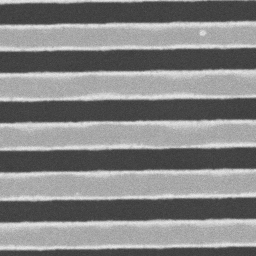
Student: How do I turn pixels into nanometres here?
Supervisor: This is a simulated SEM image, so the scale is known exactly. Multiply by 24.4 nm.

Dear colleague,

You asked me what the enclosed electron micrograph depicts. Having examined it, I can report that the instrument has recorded lines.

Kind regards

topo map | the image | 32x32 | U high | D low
DDDDDDDDDDDDDDDDDDDDDDDDDDDDDDDD
DDDDDDDDDDDDDDDDDDDDDDDDDDDDDDDD
DDDDDDDDDDDDDDDDDDDDDDDDDDDDDDDD
UUUUUUUUUUUUUUUUUUUUUUUUUUUUUUUU
UUUUUUUUUUUUUUUUUUUUUUUUUUUUUUUU
UUUUUUUUUUUUUUUUUUUUUUUUUUUUUUUU
DDDDDDDDDDDDDDDDDDDDDDDDDDDDDDDD
DDDDDDDDDDDDDDDDDDDDDDDDDDDDDDDD
DDDDDDDDDDDDDDDDDDDDDDDDDDDDDDDD
UUUUUUUUUUUUUUUUUUUUUUUUUUUUUUUU
UUUUUUUUUUUUUUUUUUUUUUUUUUUUUUUU
UUUUUUUUUUUUUUUUUUUUUUUUUUUUUUUU
DDDDDDDDDDDDDDDDDDDDDDDDDDDDDDDD
DDDDDDDDDDDDDDDDDDDDDDDDDDDDDDDD
DDDDDDDDDDDDDDDDDDDDDDDDDDDDDDDD
UUUUUUUUUUUUUUUUUUUUUUUUUUUUUUUU
UUUUUUUUUUUUUUUUUUUUUUUUUUUUUUUU
UUUUUUUUUUUUUUUUUUUUUUUUUUUUUUUU
UUUUUUUUUUUUUUUDDDDDDDDDDDDDDDDD
DDDDDDDDDDDDDDDDDDDDDDDDDDDDDDDD
DDDDDDDDDDDDDDDDDDDDDDDDDDDDDDDD
DDDDDDDDDDDDDDUUUUUUUUUUUUUUUUUU
UUUUUUUUUUUUUUUUUUUUUUUUUUUUUUUU
UUUUUUUUUUUUUUUUUUUUUUUUUUUUUUUU
UUUUUUUUUUUUUUUUUUUUUUUUUUUUUUUD
DDDDDDDDDDDDDDDDDDDDDDDDDDDDDDDD
DDDDDDDDDDDDDDDDDDDDDDDDDDDDDDDD
DDDDDDDDDDDDDDDDDDDDDDDDDDDDDDUU
UUUUUUUUUUUUUUUUUUUUUUUUUUUUUUUU
UUUUUUUUUUUUUUUUUUUUUUUUUUUUUUUU
UUUUUUUUUUUUUUUUUUUUUUUUUUUUUUUU
DDDDDDDDDDDDDDDDDDDDDDDDDDDDDDDD